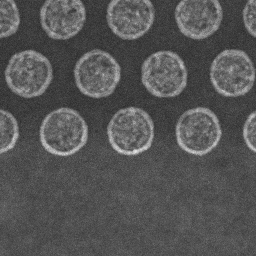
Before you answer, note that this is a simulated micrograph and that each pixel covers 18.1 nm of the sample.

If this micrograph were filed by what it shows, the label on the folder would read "raised bodies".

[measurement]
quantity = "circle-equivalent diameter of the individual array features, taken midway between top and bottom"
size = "775 nanometres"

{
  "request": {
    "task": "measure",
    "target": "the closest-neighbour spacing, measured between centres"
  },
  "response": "1.21 microns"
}